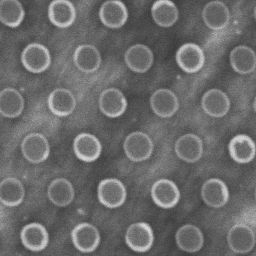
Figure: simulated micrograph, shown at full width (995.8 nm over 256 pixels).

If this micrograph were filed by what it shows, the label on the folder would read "a regular array of raised bodies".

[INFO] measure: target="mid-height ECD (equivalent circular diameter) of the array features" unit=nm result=105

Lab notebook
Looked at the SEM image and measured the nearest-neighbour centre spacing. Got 197 nm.